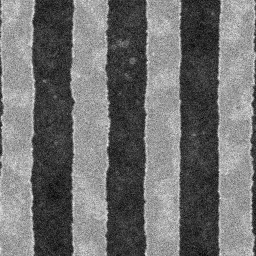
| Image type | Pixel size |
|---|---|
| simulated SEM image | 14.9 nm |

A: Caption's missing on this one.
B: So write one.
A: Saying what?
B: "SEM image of one or a few lines or trenches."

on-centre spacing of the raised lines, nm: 1090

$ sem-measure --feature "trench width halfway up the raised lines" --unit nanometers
604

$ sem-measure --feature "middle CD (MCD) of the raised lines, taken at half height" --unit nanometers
484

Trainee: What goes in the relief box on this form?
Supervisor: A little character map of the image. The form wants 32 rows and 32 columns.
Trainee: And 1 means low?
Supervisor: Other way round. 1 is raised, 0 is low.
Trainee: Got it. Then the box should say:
11110000011110000011110000001111
11110000011110000011110000001111
11110000011110000011110000001111
11110000011110000001110000001111
11110000011110000001110000001111
11110000011110000011110000001111
11110000011110000011111000001111
11110000011110000001111000011111
11110000011110000011110000011111
11110000011110000001110000011111
11110000011110000011110000011111
11110000011110000011110000011111
11110000011110000011110000011111
01110000011110000011110000011010
11110000011110000011110000011110
11110000011111000011110000011110
11110000011110000011110000011110
11110000011110000011110000011110
11110000011110000011110000011110
11110000011110000011110000001010
10010000011110000011110000001110
11100000011110000011110000001111
11110000011110000011110000011110
11110000011110000011110000011110
11110000011110000011110000011110
11110000011110000011110000011110
01110000011110000011110000011110
11110000011110000011110000011110
11110000011110000011110000011110
11110000011110000011110000011111
11110000011110000011110000011111
11110000011110000011110000001100